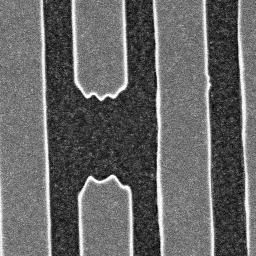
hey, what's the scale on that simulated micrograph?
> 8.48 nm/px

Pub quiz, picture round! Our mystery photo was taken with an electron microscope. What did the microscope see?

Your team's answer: one or a few lines or trenches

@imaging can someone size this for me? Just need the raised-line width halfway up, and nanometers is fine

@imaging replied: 436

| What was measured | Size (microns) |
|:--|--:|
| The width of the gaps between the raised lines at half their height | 0.262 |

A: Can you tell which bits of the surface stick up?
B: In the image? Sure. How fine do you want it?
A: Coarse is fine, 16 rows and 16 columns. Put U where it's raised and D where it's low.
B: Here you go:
UUUDDUUUDDUUUDDU
UUUDDUUUDDUUUDDU
UUUDDUUUDDUUUDDU
UUUDDUUUDDUUUDDU
UUUDDUUUDDUUUDDU
UUUDDUUUDDUUUDDU
UUUDDDDDDDUUUDDU
UUUDDDDDDDUUUDDU
UUUDDDDDDDUUUDDU
UUUDDDDDDDUUUDDU
UUUDDDDDDDUUUDDU
UUUDDUUUDDUUUDDU
UUUDDUUUDDUUUDDU
UUUDDUUUDDUUUDDU
UUUDDUUUDDUUUDDU
UUUDDUUUDDUUUDDU